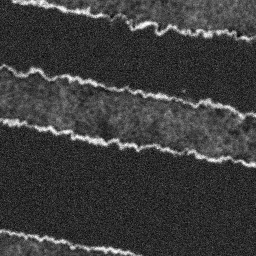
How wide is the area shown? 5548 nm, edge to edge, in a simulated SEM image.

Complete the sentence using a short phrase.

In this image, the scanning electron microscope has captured one or a few lines or trenches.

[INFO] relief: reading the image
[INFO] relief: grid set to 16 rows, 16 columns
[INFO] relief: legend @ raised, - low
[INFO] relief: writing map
@@@@------------
@@@@@@@@--------
@@@@@@@@@@@@@@@@
@@@@@@@@@@@@@@@@
-@@@@@@@@@@@@@@@
-------@@@@@@@@@
------------@@@@
----------------
@@@@@-----------
@@@@@@@@@@@@----
@@@@@@@@@@@@@@@@
@@@@@@@@@@@@@@@@
@@@@@@@@@@@@@@@@
@@@@@@@@@@@@@@@@
@@@@@@@@@@@@@@@@
-----@@@@@@@@@@@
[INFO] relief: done